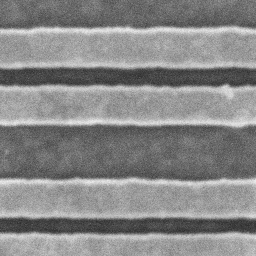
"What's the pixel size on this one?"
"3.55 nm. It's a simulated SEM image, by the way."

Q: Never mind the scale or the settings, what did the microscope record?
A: lines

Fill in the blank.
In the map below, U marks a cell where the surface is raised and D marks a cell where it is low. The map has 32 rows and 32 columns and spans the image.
DDDDDDDDDDDDDDDDDDDDDDDDDDDDDDDD
DDDDDDDDDDDDDDDDDDDDDDDDDDDDDDDD
DDDDDDDDDDDDDDDDDDDDDDDDDDDDDDDD
DDDDDDDDDDDDDDDDDDDUUDDDDDDDUUDD
UUUUUUUUUUUUUUUUUUUUUUUUUUUUUUUU
UUUUUUUUUUUUUUUUUUUUUUUUUUUUUUUU
UUUUUUUUUUUUUUUUUUUUUUUUUUUUUUUU
UUUUUUUUUUUUUUUUUUUUUUUUUUUUUUUU
DDDDDDDDDDDDDDDDDDDDDDDDDDDDDDDD
DDDDDDDDDDDDDDDDDDDDDDDDDDDDDDDD
DDDDDDDDDDDDDDDDDDDDDDDDDDDDDDDD
UUUUUUUUUUUUUUUUUUUUUUUUUUUUUUUU
UUUUUUUUUUUUUUUUUUUUUUUUUUUUUUUU
UUUUUUUUUUUUUUUUUUUUUUUUUUUUUUUU
UUUUUUUUUUUUUUUUUUUUUUUUUUUUUUUU
UUDDDDDDDDDDDDDDDDDDDDDDDDDDUUUD
DDDDDDDDDDDDDDDDDDDDDDDDDDDDDDDD
DDDDDDDDDDDDDDDDDDDDDDDDDDDDDDDD
DDDDDDDDDDDDDDDDDDDDDDDDDDDDDDDD
DDDDDDDDDDDDDDDDDDDDDDDDDDDDDDDD
DDDDDDDDDDDDDDDDDDDDDDDDDDDDDDDD
DDDDDDDDDDDDDDDDDDDDDDDDDDDDDDDD
DUUDDDDDDUUUUDDUUUDDDDDDDDDUUDDU
UUUUUUUUUUUUUUUUUUUUUUUUUUUUUUUU
UUUUUUUUUUUUUUUUUUUUUUUUUUUUUUUU
UUUUUUUUUUUUUUUUUUUUUUUUUUUUUUUU
UUUUUUUUUUUUUUUUUUUUUUUUUUUUUUUU
DDDDDDDDDDDDDDDDDDDDDDDDDDDDDDDD
DDDDDDDDDDDDDDDDDDDDDDDDDDDDDDDD
UUUUUUUUUUUUUUUUUUUUUUUUUUUUUUUU
UUUUUUUUUUUUUUUUUUUUUUUUUUUUUUUU
UUUUUUUUUUUUUUUUUUUUUUUUUUUUUUUU